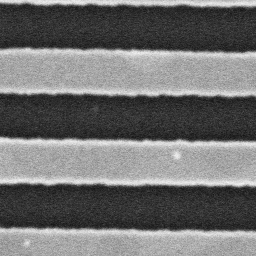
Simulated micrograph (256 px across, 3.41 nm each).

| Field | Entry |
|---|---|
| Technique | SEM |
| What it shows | lines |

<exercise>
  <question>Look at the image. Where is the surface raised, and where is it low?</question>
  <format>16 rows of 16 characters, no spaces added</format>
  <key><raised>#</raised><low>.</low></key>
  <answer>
................
................
................
################
################
################
................
................
................
################
################
.......##.######
................
................
################
################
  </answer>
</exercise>